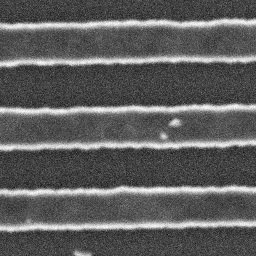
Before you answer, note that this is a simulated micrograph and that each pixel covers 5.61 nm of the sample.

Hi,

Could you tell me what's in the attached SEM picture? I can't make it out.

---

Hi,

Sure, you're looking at lines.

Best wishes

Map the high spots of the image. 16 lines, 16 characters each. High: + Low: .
................
......++++++++++
++++++++++++++++
++++++++++++++++
................
................
................
++++++++++++++++
++++++++++++++++
................
................
................
++++++++++++++++
++++++++++++++++
................
................